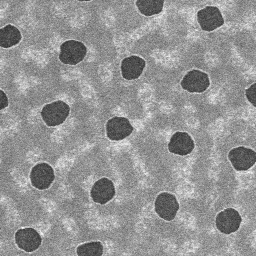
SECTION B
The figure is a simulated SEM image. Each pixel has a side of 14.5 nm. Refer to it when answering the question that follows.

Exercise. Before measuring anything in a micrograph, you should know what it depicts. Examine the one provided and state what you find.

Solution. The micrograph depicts a regular array of holes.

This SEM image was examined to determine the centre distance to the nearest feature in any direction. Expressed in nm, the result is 921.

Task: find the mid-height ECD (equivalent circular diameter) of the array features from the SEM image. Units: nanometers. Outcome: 376